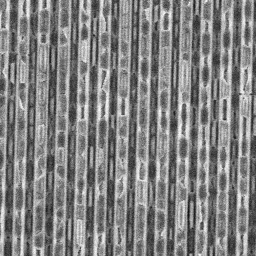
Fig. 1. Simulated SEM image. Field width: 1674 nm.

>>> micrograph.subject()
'parallel lines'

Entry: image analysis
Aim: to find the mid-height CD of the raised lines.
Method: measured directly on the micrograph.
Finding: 71.9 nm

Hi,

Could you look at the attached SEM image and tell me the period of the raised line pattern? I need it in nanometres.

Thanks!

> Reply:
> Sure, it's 133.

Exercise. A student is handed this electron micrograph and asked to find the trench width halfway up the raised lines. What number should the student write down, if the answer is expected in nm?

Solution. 60.5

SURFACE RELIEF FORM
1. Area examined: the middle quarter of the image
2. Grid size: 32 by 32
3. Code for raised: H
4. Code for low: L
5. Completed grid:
HLLLHHLLLHHLLLHHLLLHHLLLHHHLLHHH
HLLLHHLLLHHLLLHHLLLHHLLLHHHLLHHH
HLLLHHLLLHHLLLHHLLLHHLLLHHHLLHHH
HLLLHHLLLHHLLLHHLLLHHLLLHHHLLHHH
HLLLHHLLLHHLLLHHLLLHHLLLHHLLLHHH
HLLLHHLLLHHLLLHHLLLHHLLLHHLLLHHH
HLLHHHLLLHHLLLHHLLLHHLLLHHLLLHHL
HLLHHHLLLHHLLLHHLLLHHLLLHHLLLHHL
HLLHHHLLHHHLLLHHLLLHHLLLHHLLLHHL
HLLHHHLLHHHLLLHHLLLHHLLLHHLLLHHL
HLLHHHLLHHHLLHHHLLLHHLLLHHLLLHHL
HLLLHHLLHHHLLHHHLLLHHLLLHHLLLHHL
HLLLHHLLHHHLLHHHLLHHHLLLHHLLLHHL
HLLLHHLLHHHLLHHHLLHHHLLLHHLLLHHL
HLLLHHLLHHHLLHHHLLHHHLLHHHLLLHHL
HLLHHHLLHHHLLHHHLLHHHLLHHHLLLHHL
HLLHHHLLHHHLLHHHLLHHHLLHHHLLLHHL
HLLHHHLLHHHLLHHHLLHHHLLHHHLLLHHL
HLLHHHLLHHHLLHHHLLHHHLLHHHLLLHHL
HLLHHHLLHHHLLHHHLLHHHLLHHHLLLHHL
HLLHHHLLHHHLLHHHLLHHHLLHHHLLLHHL
HLLHHHLLHHHLLHHHLLHHHLLHHHLLLHHL
HLLHHHLLHHHLLHHHLLHHHLLHHHLLLHHL
HLLHHHLLHHHLLHHHLLHHHLLHHHLLLHHL
HLLHHHLLHHHLLHHHLLHHHLLHHHLLLHHL
LLLHHHLLHHHLLHHHLLHHHLLHHHLLHHHL
LLLHHHLLHHHLLHHHLLHHHLLHHHLLHHHL
LLLHHLLLHHHLLHHHLLHHHLLHHHLLHHHL
LLLHHLLLHHHLLHHHLLHHHLLHHHLLHHHL
LLLHHLLLHHLLLHHHLLHHHLLHHHLLHHHL
LLLHHLLLHHLLLHHHLLHHHLLHHHLLHHHL
LLLHHLLLHHLLLHHLLLHHHLLHHHLLHHHL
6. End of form